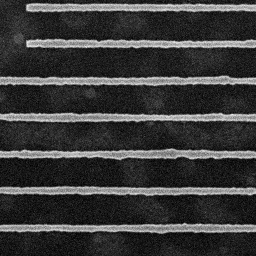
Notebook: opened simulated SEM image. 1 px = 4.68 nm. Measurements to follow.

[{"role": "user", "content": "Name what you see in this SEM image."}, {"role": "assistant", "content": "parallel lines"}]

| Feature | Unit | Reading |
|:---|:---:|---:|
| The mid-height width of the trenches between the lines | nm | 144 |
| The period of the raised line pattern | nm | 172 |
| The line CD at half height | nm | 28.6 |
